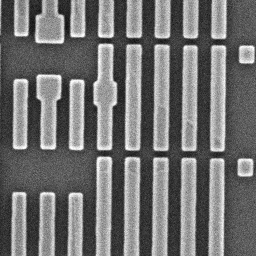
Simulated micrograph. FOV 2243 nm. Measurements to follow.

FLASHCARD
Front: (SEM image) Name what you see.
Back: wiring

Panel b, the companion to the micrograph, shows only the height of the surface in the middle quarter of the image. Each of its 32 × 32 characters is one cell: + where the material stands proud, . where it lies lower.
.........+++....+++....+++....++
.........+++....+++....+++....++
.........+++....+++....+++....++
.........+++....+++....+++....++
..+++...+++++...+++....+++....++
..+++...+++++...+++....+++....++
..+++...+++++...+++....+++....++
..+++...+++++...+++....+++....++
..+++...+++++...+++....+++....++
..+++...+++++...+++....+++....++
..+++...++++....+++....+++....++
..+++....+++....+++....+++....++
..+++....+++....+++....+++....++
..+++....+++....+++....+++....++
..+++....+++....+++....+++....++
..+++....+++....+++....+++....++
..+++....+++....+++....+++....++
..+++....+++....+++....+++....++
..+++....+++....+++....+++....++
..+++....+++....+++....+++....++
..+++....+++....+++....+++....++
................+++....+++....++
................................
.........++.....++..............
........++++...++++....+++....++
........++++...++++....+++....++
........++++...++++....+++....++
........++++...++++....+++....++
........++++...++++....+++....++
........++++...++++...++++....++
........++++...++++...++++....++
........++++...++++...++++...+++